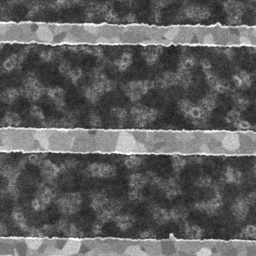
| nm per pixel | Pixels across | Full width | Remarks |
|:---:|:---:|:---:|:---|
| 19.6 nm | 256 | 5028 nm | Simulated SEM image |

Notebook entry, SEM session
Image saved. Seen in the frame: one or a few lines or trenches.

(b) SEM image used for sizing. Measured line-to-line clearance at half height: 1660 nm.